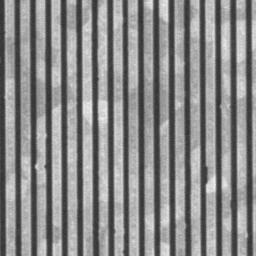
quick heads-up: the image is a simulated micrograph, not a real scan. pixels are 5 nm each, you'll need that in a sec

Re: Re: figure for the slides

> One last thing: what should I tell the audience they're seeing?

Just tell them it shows parallel lines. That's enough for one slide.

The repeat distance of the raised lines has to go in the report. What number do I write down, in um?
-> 0.077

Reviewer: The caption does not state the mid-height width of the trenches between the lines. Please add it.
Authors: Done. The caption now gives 36.2 nm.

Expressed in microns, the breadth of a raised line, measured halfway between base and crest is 0.0406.